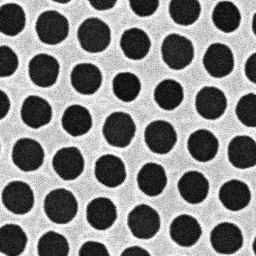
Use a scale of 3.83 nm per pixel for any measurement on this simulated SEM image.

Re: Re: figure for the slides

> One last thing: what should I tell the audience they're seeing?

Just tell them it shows a regular array of holes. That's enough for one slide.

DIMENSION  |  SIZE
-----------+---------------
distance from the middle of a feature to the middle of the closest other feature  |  161 nm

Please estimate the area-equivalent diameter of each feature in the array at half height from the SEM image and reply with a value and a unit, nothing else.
126 nm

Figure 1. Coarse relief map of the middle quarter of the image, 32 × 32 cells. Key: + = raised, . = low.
+++.....++++++++++++++++++.....+
++.......+++++++++++++++++++.+++
++.......++++....+++++++++++++++
++........++.......+++++++++++++
++........++.......+++++....++++
++.......+++.......++++......+++
+++.....++++.......++++.......++
++++...++++++......+++........++
+++++++++++++.....++++........++
+++++++++++++++.+++++++......+++
+....+++++++++++++++++++.....+++
......+++++++++++++++++++..+++++
.......+++++....++++++++++++++++
.......++++......+++++++++++++++
.......+++........++++....++++++
.......+++........+++......+++++
......++++........++........++++
+....+++++........++........++++
++++++++++.......+++........+++.
+++++++++++......+++........+++.
++++++++++++....+++++.......+++.
....++++++++++++++++++.....++++.
....+++++++.++++++++++++..++++++
.....++++.....++++++++++++++++++
.....+++.......+++++++++++++++++
.....+++.......+++++....++++++++
.....+++.......++++......+++++++
....+++.........++.......+++++..
...+++++.......+++........+++...
+++++++++......+++........++....
++++++++++....++++.......+++....
.++++++++++++++++++......++++...